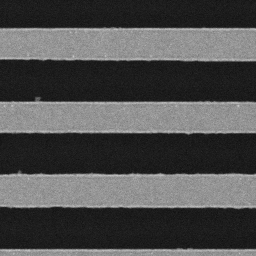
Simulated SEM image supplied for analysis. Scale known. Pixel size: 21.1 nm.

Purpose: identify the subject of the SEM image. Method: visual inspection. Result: lines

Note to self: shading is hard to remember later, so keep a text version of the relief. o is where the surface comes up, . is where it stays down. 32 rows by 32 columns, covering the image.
................................
................................
................................
................................
oooooooooooooooooooooooooooooooo
oooooooooooooooooooooooooooooooo
oooooooooooooooooooooooooooooooo
..................o....ooooooooo
................................
................................
................................
................................
................................
oooooooooooooooooooooooooooooooo
oooooooooooooooooooooooooooooooo
oooooooooooooooooooooooooooooooo
oooooooooooooooooooooooooooooooo
................................
................................
................................
................................
................................
oooooooooooooooooooooooooooooooo
oooooooooooooooooooooooooooooooo
oooooooooooooooooooooooooooooooo
oooooooooooooooooooooooooooooooo
................................
................................
................................
................................
................................
oooooooooooooooooooooooooooooooo